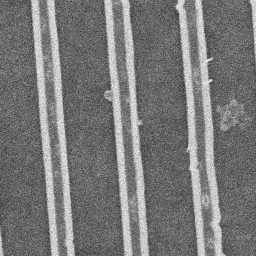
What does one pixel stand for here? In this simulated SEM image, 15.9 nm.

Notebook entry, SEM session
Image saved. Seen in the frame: one or a few lines or trenches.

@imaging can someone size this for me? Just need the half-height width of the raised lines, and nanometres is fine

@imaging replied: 264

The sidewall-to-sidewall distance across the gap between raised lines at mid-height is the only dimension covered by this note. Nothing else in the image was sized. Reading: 0.898 µm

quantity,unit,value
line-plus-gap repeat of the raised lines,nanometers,1170